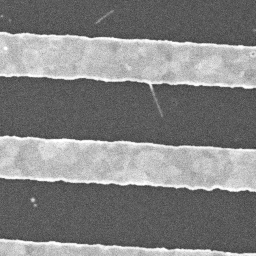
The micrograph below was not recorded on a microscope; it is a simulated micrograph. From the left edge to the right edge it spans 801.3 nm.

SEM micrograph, lines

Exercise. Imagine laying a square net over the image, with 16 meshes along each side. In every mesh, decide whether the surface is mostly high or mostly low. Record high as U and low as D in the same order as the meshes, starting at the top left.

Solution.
DDDDDDDDDDDDDDDD
DDDDDDDDDDDDDDDD
UUUUUUUUUDDDDDDD
UUUUUUUUUUUUUUUU
UUUUUUUUUUUUUUUU
DDDDDDDDDDDDDDDD
DDDDDDDDDDDDDDDD
DDDDDDDDDDDDDDDD
DDDDDDDDDDDDDDDD
UUUUUUUUUUUUUUUU
UUUUUUUUUUUUUUUU
DDDDDDDDDUUUUUUU
DDDDDDDDDDDDDDDD
DDDDDDDDDDDDDDDD
DDDDDDDDDDDDDDDD
UUUUUUUUUDDDDDDD